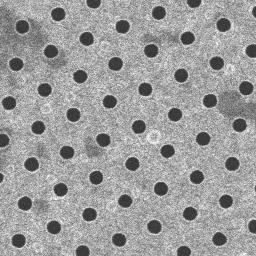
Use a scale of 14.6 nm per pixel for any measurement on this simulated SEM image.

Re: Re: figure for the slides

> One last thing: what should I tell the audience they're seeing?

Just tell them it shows a regular array of holes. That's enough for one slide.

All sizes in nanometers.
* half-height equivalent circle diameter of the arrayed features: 197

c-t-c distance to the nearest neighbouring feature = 549 nanometers